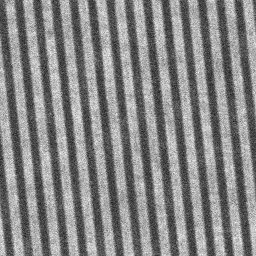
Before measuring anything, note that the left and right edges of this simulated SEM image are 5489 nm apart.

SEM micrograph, parallel lines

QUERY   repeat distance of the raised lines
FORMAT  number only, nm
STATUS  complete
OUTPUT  390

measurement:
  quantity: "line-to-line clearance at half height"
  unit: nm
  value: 202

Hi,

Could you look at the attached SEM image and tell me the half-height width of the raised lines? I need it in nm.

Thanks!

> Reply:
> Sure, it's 181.